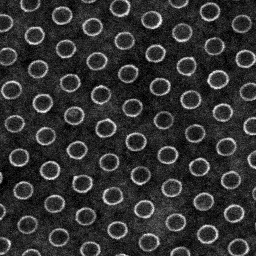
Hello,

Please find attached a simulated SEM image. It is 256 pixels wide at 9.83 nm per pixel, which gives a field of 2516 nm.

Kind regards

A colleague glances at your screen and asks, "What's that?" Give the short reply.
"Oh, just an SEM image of a regular array of raised bodies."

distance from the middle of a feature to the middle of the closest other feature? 33.2 pixels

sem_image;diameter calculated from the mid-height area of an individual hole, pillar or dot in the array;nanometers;181